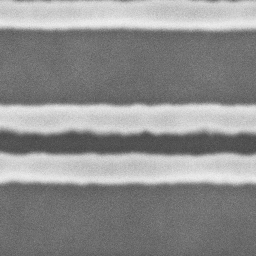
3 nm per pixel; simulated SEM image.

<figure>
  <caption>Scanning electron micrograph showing lines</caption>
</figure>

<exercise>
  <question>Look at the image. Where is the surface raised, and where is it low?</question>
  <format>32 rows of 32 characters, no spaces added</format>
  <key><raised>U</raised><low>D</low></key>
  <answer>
UUUUUUUUUUUUUUUUUUUUUUUUUUUUUUUU
UUUUUUUUUUUUUUUUUUUUUUUUUUUUUUUU
UUUUUUUUUUUUUUUUUUUUUUUUUUUUUUUU
DDDDDUUDDDDDDDDDDDDDDDDDDUUUDDDD
DDDDDDDDDDDDDDDDDDDDDDDDDDDDDDDD
DDDDDDDDDDDDDDDDDDDDDDDDDDDDDDDD
DDDDDDDDDDDDDDDDDDDDDDDDDDDDDDDD
DDDDDDDDDDDDDDDDDDDDDDDDDDDDDDDD
DDDDDDDDDDDDDDDDDDDDDDDDDDDDDDDD
DDDDDDDDDDDDDDDDDDDDDDDDDDDDDDDD
DDDDDDDDDDDDDDDDDDDDDDDDDDDDDDDD
DDDDDDDDDDDDDDDDDDDDDDDDDDDDDDDD
DDDDDDDDDDDDDDDDDDDDDDDDDDDDDDDD
UUUUUUUUUUUUUUUUUUUUUUUUUUUUUUUU
UUUUUUUUUUUUUUUUUUUUUUUUUUUUUUUU
UUUUUUUUUUUUUUUUUUUUUUUUUUUUUUUU
DDUUUUUUDDDDUUUUUUDUUUUUDDDDUUUU
DDDDDDDDDDDDDDDDDDDDDDDDDDDDDDDD
DDDDDDDDDDDDDDDDDDDDDDDDDDDDDDDD
UUUUUUUUUUUUUUUUUUUUUUUUDUUUUUUU
UUUUUUUUUUUUUUUUUUUUUUUUUUUUUUUU
UUUUUUUUUUUUUUUUUUUUUUUUUUUUUUUU
DDDDDUUUUUUUUUUUUUUUUUDDDDDUUUUU
DDDDDDDDDDDDDDDDDDDDDDDDDDDDDDDD
DDDDDDDDDDDDDDDDDDDDDDDDDDDDDDDD
DDDDDDDDDDDDDDDDDDDDDDDDDDDDDDDD
DDDDDDDDDDDDDDDDDDDDDDDDDDDDDDDD
DDDDDDDDDDDDDDDDDDDDDDDDDDDDDDDD
DDDDDDDDDDDDDDDDDDDDDDDDDDDDDDDD
DDDDDDDDDDDDDDDDDDDDDDDDDDDDDDDD
DDDDDDDDDDDDDDDDDDDDDDDDDDDDDDDD
DDDDDDDDDDDDDDDDDDDDDDDDDDDDDDDD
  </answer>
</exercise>